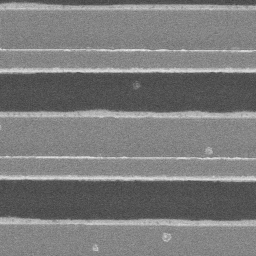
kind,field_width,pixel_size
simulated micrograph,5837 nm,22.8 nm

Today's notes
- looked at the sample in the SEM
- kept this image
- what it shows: lines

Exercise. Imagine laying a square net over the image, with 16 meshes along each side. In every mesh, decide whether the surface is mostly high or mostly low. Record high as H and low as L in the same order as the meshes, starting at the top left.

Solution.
LLLLLLLLLLLLLLLL
HHHHHHHHHHHHHHHH
HHHHHHHHHHHHHHHH
HHHHHHHHHHHHHHHH
HHLLLLLLLLLLLLLL
LLLLLLLLLLLLLLLL
LLLLLLLLLLLLLLLL
HHHHHHHHHHHHHHHH
HHHHHHHHHHHHHHHH
HHHHHHHHHHHHHHHH
HHHHHHHHHHHHHHHH
LLLLLLLLLLLLLLLL
LLLLLLLLLLLLLLLL
LLLLLLLLLLLLLLLL
HHHHHHHHHHHHHHHH
HHHHHHHHHHHHHHHH